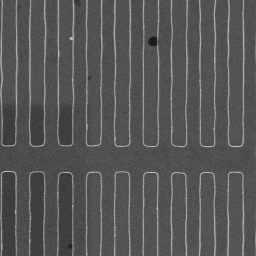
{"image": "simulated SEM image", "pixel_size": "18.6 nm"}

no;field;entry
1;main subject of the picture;groups of lines, slits or small figures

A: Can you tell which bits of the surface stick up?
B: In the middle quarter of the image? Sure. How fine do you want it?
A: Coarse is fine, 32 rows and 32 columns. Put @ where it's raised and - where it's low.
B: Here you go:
--@@@@---@@@@----@@@----@@@----@
--@@@@---@@@@----@@@----@@@----@
--@@@@---@@@@----@@@----@@@----@
--@@@@---@@@@----@@@----@@@----@
--@@@@---@@@@----@@@----@@@----@
--@@@@---@@@@----@@@----@@@----@
--@@@@---@@@@----@@@----@@@----@
--@@@@---@@@@----@@@----@@@----@
--@@@@---@@@@----@@@----@@@----@
--@@@@---@@@@----@@@----@@@----@
--@@@@---@@@@----@@@----@@@----@
--@@@----@@@@----@@@----@@@---@@
--@@@@---@@@@----@@@----@@@---@@
--@@@@---@@@@----@@@----@@@----@
--@@@@---@@@@---@@@@----@@@----@
--@@@@---@@@@---@@@@----@@@----@
--@@@@---@@@@---@@@@----@@@----@
--@@@@---@@@@----@@@----@@@----@
--@@@----@@@@----@@@----@@@----@
--@@@@---@@@@----@@@----@@@----@
@@@@@@@@@@@@@@-@@@@@@--@@@@@--@@
@@@@@@@@@@@@@@@@@@@@@@@@@@@@@@@@
@@@@@@@@@@@@@@@@@@@@@@@@@@@@@@@@
@@@@@@@@@@@@@@@@@@@@@@@@@@@@@@@@
@@@@@@@@@@@@@@@@@@@@@@@@@@@@@@@@
@@@@@@@@@@@@@@@@@@@@@@@@@@@@@@@@
@@@@@@@@@@@@@@@@@@@@@@@@@@@@@@@@
--@@@@---@@@@---@@@@---@@@@---@@
--@@@@---@@@@---@@@@----@@@---@@
--@@@@---@@@@----@@@----@@@----@
--@@@----@@@@----@@@----@@@----@
--@@@----@@@@----@@@----@@@----@